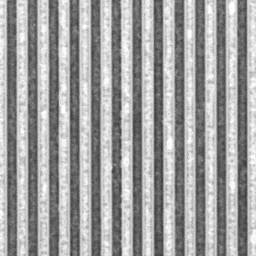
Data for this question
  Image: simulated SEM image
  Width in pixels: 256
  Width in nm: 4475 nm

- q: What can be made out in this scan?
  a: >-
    parallel lines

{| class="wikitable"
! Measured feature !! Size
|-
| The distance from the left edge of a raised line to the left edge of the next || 20.9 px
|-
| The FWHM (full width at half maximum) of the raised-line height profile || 186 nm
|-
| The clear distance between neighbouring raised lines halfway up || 10.6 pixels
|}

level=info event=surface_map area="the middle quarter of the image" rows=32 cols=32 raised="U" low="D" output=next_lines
UDDDUUDDDUUUDDUUUDDDUUDDDUUDDDUU
UDDDUUDDDUUUDDUUUDDDUUDDDUUDDDUU
UDDDUUDDDUUUDDUUUDDDUUDDDUUDDDUU
UDDDUUDDDUUUDDDUUDDDUUDDDUUDDDUU
UDDDUUDDDUUUDDUUUDDDUUDDDUUDDDUU
UDDDUUDDDUUUDDUUUDDDUUDDDUUDDDUU
UDDDUUDDDUUUDDUUUDDDUUDDDUUDDDUU
UDDDUUDDDUUUDDDUUDDDUUDDDUUDDDUU
UDDDUUDDDUUUDDDUUDDDUUDDDUUDDDUU
UDDDUUDDDUUUDDDUUDDDUUDDDUUDDDUU
UDDDUUDDDUUUDDDUUDDDUUDDDUUDDDUU
UDDDUUDDDUUUDDDUUDDDUUDDDUUDDDUU
UDDDUUDDDUUUDDDUUDDDUUDDDUUDDDUU
UDDDUUDDDUUUDDDUUDDDUUDDDUUDDDUU
UDDDUUDDDUUUDDUUUDDDUUDDDUUDDDUU
UDDDUUDDDUUUDDUUUDDDUUDDDUUDDDUU
UDDDUUDDDUUUDDDUUDDDUUDDDUUDDDUU
UDDDUUDDDUUUDDDUUDDDUUDDDUUDDDUU
UDDDUUDDDUUUDDDUUDDDUUDDDUUUDDUU
UDDDUUDDDUUUDDDUUDDDUUDDDUUUDDUU
UDDDUUDDDUUUDDDUUDDDUUDDDUUUDDUU
UDDDUUDDDUUUDDDUUDDDUUDDDUUUDDUU
UDDDUUDDDUUUDDDUUDDDUUDDDUUUDDUU
UDDDUUDDDUUUDDDUUDDDUUDDDUUUDDUU
UDDDUUUDDUUUDDDUUDDDUUDDDUUUDDUU
UDDDUUUDDUUUDDDUUDDDUUDDDUUUDDUU
UDDDUUUDDUUUDDDUUDDDUUDDDUUUDDUU
UDDDUUUDDUUUDDDUUDDDUUDDDUUUDDUU
UDDDUUUDDUUUDDUUUDDDUUDDDUUUDDUU
UDDDUUUDDUUUDDUUUDDDUUDDDUUUDDUU
UDDDUUUDDUUUDDUUUDDDUUDDDUUUDDUU
UDDDUUUDDUUUDDUUUDDDUUDDDUUUDDUU